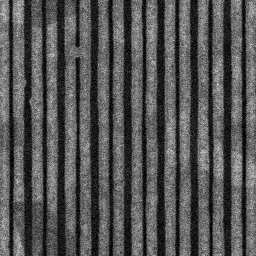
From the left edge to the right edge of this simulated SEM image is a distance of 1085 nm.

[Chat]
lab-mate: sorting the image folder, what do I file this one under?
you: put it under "parallel lines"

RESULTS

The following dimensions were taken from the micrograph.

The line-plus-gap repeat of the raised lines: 71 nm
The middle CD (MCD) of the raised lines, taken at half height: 42.4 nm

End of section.